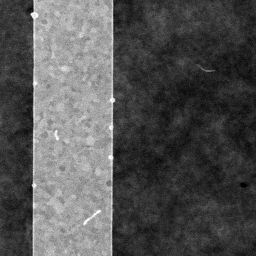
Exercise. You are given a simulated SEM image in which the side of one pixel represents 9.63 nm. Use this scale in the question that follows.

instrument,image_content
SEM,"one or a few lines or trenches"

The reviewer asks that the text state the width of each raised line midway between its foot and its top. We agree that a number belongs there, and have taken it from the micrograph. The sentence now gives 757 nm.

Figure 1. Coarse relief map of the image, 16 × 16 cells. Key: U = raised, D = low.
DDUUUUUDDDDDDDDD
DDUUUUUDDDDDDDDD
DDUUUUUDDDDDDDDD
DDUUUUUDDDDDDDDD
DDUUUUUDDDDDDDDD
DDUUUUUDDDDDDDDD
DDUUUUUDDDDDDDDD
DDUUUUUDDDDDDDDD
DDUUUUUDDDDDDDDD
DDUUUUUDDDDDDDDD
DDUUUUUDDDDDDDDD
DDUUUUUDDDDDDDDD
DDUUUUUDDDDDDDDD
DDUUUUUDDDDDDDDD
DDUUUUUDDDDDDDDD
DDUUUUUDDDDDDDDD